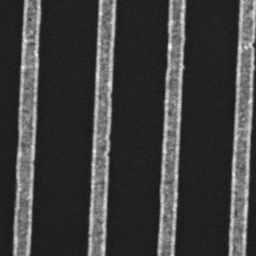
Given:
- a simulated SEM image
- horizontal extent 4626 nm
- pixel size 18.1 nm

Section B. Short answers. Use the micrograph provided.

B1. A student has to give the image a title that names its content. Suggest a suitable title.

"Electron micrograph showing one or a few lines or trenches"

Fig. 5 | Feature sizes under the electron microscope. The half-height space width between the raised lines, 1040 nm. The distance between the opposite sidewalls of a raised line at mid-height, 235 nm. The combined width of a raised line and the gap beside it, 1300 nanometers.